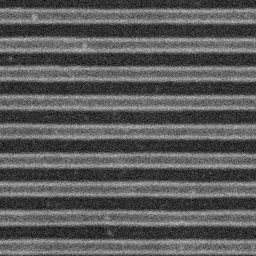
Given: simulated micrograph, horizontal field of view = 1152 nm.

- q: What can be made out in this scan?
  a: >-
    parallel lines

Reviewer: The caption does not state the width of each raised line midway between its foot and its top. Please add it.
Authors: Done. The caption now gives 60.1 nm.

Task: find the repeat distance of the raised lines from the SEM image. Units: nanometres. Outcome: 130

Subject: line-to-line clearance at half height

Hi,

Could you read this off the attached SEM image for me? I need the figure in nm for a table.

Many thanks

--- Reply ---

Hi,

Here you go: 72.5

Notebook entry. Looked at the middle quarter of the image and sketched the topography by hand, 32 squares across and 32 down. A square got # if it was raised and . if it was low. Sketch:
................................
################################
################################
################################
................................
................................
................................
................................
################################
################################
################################
................................
................................
................................
................................
###################.............
################################
################################
########......................##
................................
................................
................................
.##..............#############..
################################
################################
################################
................................
................................
................................
................................
################################
################################